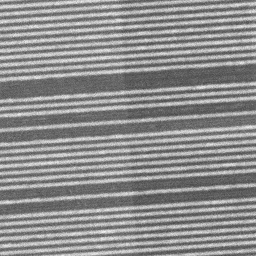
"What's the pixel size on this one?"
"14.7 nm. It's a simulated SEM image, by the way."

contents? parallel lines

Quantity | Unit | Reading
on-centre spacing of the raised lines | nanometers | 106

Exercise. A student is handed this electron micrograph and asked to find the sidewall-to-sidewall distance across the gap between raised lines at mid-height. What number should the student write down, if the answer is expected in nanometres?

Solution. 73.2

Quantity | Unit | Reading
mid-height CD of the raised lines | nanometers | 36.5